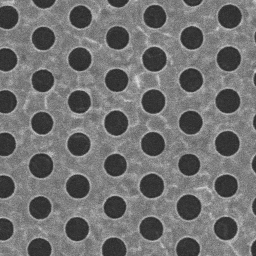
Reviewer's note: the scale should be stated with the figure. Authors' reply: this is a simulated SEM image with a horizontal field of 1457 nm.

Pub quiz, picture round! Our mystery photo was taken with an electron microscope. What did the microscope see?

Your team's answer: a regular array of holes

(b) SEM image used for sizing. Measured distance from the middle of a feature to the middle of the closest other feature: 0.24 micrometres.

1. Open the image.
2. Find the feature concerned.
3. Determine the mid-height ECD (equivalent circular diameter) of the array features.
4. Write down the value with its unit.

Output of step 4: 137 nm